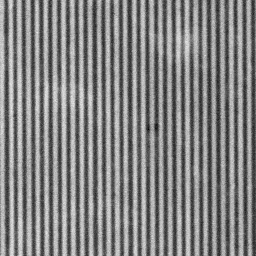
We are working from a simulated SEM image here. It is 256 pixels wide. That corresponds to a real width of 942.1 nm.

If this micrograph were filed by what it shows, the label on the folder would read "parallel lines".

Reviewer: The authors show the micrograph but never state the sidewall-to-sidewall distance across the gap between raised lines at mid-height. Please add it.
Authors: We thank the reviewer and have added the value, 19.8 nm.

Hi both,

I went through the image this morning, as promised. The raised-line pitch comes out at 32.4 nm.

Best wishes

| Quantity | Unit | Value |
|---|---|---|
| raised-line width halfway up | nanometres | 13.3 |